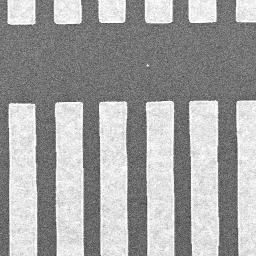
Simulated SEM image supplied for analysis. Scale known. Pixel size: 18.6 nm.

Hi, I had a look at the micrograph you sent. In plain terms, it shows wiring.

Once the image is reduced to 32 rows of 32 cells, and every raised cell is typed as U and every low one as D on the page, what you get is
DUUUDDDUUUDDUUUUDDUUUDDDUUUDDDUU
DUUUDDDUUUDDUUUUDDUUUDDDUUUDDDUU
DUUUDDDUUUDDDUUDDDUUUDDDUUUDDDUU
DDDDDDDDDDDDDDDDDDDDDDDDDDDDDDDD
DDDDDDDDDDDDDDDDDDDDDDDDDDDDDDDD
DDDDDDDDDDDDDDDDDDDDDDDDDDDDDDDD
DDDDDDDDDDDDDDDDDDDDDDDDDDDDDDDD
DDDDDDDDDDDDDDDDDDDDDDDDDDDDDDDD
DDDDDDDDDDDDDDDDDDDDDDDDDDDDDDDD
DDDDDDDDDDDDDDDDDDDDDDDDDDDDDDDD
DDDDDDDDDDDDDDDDDDDDDDDDDDDDDDDD
DDDDDDDDDDDDDDDDDDDDDDDDDDDDDDDD
DDDDDDDDDDDDDDDDDDDDDDDDDDDDDDDD
DUUUDDDUUUDDDUUUDDUUUUDDUUUDDDUU
DUUUDDDUUUDDDUUUDDUUUUDDUUUDDDUU
DUUUDDDUUUDDDUUUDDUUUUDDUUUDDDUU
DUUUDDDUUUDDDUUUDDUUUUDDUUUDDDUU
DUUUDDDUUUDDDUUUDDUUUUDDUUUDDDUU
DUUUDDDUUUDDDUUUDDUUUUDDUUUDDDUU
DUUUDDDUUUDDDUUUDDUUUUDDUUUDDDUU
DUUUDDDUUUDDDUUUDDUUUUDDUUUDDDUU
DUUUDDDUUUDDDUUUDDUUUUDDUUUDDDUU
DUUUDDDUUUDDDUUUDDUUUUDDUUUDDDUU
DUUUUDDUUUDDDUUUDDUUUUDDUUUDDDUU
DUUUUDDUUUDDDUUUDDUUUUDDUUUDDDUU
DUUUUDDUUUDDDUUUDDDUUUDDUUUDDDUU
DUUUUDDUUUDDDUUUDDDUUUDDUUUDDDUU
DUUUUDDUUUDDDUUUDDDUUUDDUUUDDDUU
DUUUUDDUUUDDDUUUDDDUUUDDUUUDDDUU
DUUUUDDUUUDDDUUUDDDUUUDDUUUDDDUU
DUUUUDDUUUDDDUUUDDDUUUDDUUUDDDUU
DUUUUDDUUUDDDUUUDDDUUUDDUUUDDDUU